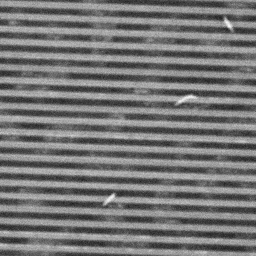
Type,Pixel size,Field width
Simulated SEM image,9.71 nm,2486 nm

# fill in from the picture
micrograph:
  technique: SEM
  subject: parallel lines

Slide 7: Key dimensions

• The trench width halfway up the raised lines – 83.7 nm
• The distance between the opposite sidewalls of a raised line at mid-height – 41.2 nm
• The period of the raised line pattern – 12.8 pixels